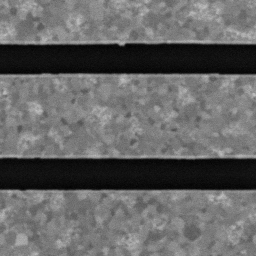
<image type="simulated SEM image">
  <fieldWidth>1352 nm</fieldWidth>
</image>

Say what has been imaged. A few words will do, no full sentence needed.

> one or a few lines or trenches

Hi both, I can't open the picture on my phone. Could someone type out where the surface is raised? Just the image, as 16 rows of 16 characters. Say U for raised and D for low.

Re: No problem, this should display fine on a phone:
UUUUUUUUUUUUUUUU
UUUUUUUUUUUUUUUU
UUUUUUUUUUUUUUUU
DDDDDDDDDDDDDDDD
DDDDDDDDDDDDDDDD
UUUUUUUUUUUUUUUU
UUUUUUUUUUUUUUUU
UUUUUUUUUUUUUUUU
UUUUUUUUUUUUUUUU
UUUUUUUUUUUUUUUU
DDDDDDDDDDDDDDDD
DDDDDDDDDDDDDDDD
UUUUUUUUUUUUUUUU
UUUUUUUUUUUUUUUU
UUUUUUUUUUUUUUUU
UUUUUUUUUUUUUUUU